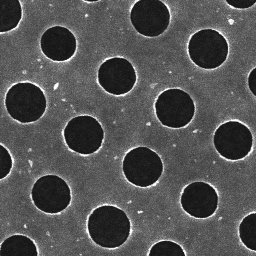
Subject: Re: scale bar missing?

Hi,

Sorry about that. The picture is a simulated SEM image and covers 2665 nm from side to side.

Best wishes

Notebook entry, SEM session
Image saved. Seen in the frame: a regular array of holes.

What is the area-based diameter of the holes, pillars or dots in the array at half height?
0.408 microns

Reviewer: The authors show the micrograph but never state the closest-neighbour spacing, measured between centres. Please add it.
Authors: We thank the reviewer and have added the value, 690 nm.